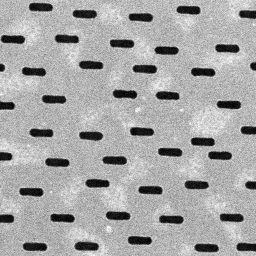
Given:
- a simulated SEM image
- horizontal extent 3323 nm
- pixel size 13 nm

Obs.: a regular array of holes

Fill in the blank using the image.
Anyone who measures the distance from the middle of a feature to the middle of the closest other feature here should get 0.443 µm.